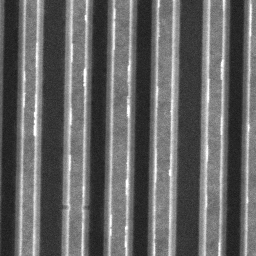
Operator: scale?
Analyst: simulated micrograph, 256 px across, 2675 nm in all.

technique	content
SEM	parallel lines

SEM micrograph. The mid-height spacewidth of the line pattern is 230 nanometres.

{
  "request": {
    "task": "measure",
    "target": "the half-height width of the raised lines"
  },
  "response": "209 nanometres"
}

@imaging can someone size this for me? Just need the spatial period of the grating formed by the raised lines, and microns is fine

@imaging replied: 0.484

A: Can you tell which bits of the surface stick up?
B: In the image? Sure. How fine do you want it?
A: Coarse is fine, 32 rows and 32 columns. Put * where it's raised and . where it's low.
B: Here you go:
...**....**...***..***....**...*
...**....**...***..***....**...*
...**....**...***..***....**...*
...**....**...***..***....**...*
...**....**...***..***....**...*
...**....**...***..***....**...*
...**....**...**...***....**...*
...**....**...**...***....**...*
...**....**...**...***....**...*
...**....**...**...***....**...*
...**....**...**...***....**...*
...**....**...**...***....**...*
...**...***...**...***....**...*
...**...***...**...***....**...*
...**...***...**...***....**...*
...**...***...**...***....**...*
...**...***...**...***....**...*
...**...***...**...***....**...*
...**...***...**...***....**...*
..***...***...**...***...***...*
..***...***...**...***...***...*
..***...***...**...***...***...*
..***...***...**...***...***...*
..***...***...**...***...***...*
..***...***...**...***...***...*
..***...***...**...***...***...*
..***...***..***...***...***...*
..**....***..***...**....***...*
..**....***..***...**....***...*
..**....***..***...**....***...*
..**....***..***...**....***...*
..**....***..***...**....***...*